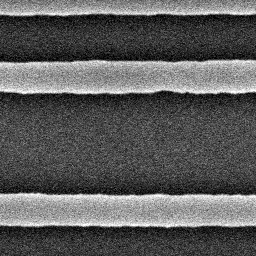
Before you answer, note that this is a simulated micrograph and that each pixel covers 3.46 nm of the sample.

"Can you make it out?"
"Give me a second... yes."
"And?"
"lines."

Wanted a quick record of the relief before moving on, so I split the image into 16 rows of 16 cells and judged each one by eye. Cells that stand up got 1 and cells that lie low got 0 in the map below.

1111111111111111
0000000000000000
0000000000000000
0000000000000000
1111111111111111
1111111111111111
0000000000000000
0000000000000000
0000000000000000
0000000000000000
0000000000000000
0000000000000000
1111111111111111
1111111111111111
0000000000000000
0000000000000000